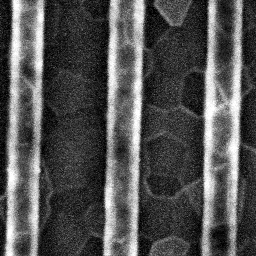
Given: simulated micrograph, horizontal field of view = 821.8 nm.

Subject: one or a few lines or trenches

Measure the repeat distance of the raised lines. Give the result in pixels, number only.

98.5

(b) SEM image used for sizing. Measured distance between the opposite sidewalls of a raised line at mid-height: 0.0871 um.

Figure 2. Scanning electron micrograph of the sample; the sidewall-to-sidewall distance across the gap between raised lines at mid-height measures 230 nanometres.